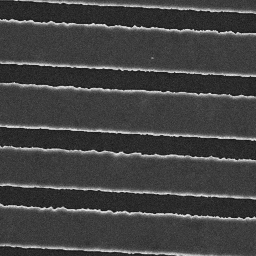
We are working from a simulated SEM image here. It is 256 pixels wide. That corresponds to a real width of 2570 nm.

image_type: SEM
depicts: lines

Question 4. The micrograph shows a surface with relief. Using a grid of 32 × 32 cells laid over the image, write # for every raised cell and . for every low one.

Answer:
..........######################
.............................###
##..............................
####################............
################################
################################
################################
################################
...........#####################
..............................##
##..............................
####################............
################################
################################
################################
################################
.............###################
...............................#
##..............................
####################.#..........
################################
################################
################################
.......#########################
...........................#####
................................
################................
################################
################################
################################
################################
...............#################